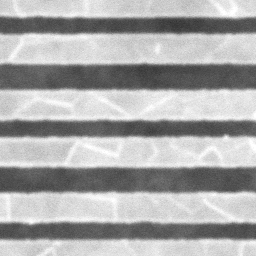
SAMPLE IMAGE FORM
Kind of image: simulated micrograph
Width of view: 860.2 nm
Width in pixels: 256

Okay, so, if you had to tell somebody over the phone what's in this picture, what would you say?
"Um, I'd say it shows lines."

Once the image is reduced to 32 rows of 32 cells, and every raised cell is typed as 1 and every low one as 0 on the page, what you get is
11111111111111111111111111111111
11111111111111111111111111111111
00000000000000000000000000000000
00000000000000000000000000000000
11111111111111111111111111111111
11111111111111111111111111111111
11111111111111111111111111111111
11111111111111111111111111111111
00000000000000000000000000000000
00000000000000000000000000000000
00000000000000000000000000000000
11111111111111111111111111111111
11111111111111111111111111111111
11111111111111111111111111111111
11111111111111111111111111111111
00000000000000000000000000000000
00000000000000000000000000000000
11111111111111111111111111111111
11111111111111111111111111111111
11111111111111111111111111111111
11111111111111111111111111111111
00000000000000000000000000000000
00000000000000000000000000000000
00000000000000000000000000000000
11111111111111111111111111111111
11111111111111111111111111111111
11111111111111111111111111111111
11111111111111111111111111111111
00000000000000000000000000000000
00000000000000000000000000000000
11111111111111111111111111111111
11111111111111111111111111111111